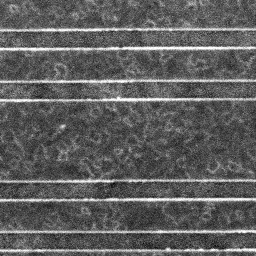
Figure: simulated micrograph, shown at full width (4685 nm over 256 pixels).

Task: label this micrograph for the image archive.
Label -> lines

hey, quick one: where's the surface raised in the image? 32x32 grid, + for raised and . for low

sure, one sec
++++++++++++++++++++++++++++++++
++++++++++++++++++++++++++++++++
++++++++++++++++++++++++++++++++
++++++++++++++++++++++++++++++++
................................
................................
++++++++++++++++++++++++++++++++
++++++++++++++++++++++++++++++++
++++++++++++++++++++++++++++++++
++++++++++++++++++++++++++++++++
................................
................................
.............+++++++++++++++++++
++++++++++++++++++++++++++++++++
++++++++++++++++++++++++++++++++
++++++++++++++++++++++++++++++++
++++++++++++++++++++++++++++++++
++++++++++++++++++++++++++++++++
++++++++++++++++++++++++++++++++
++++++++++++++++++++++++++++++++
++++++++++++++++++++++++++++++++
++++++++++++++++++++++++++++++++
++++++++++++++++++++++++++++++++
................................
................................
++++++++++++++++++++++++++++++++
++++++++++++++++++++++++++++++++
++++++++++++++++++++++++++++++++
++++++++++++++++++++++++++++++++
................................
................................
++++++++++++++++++++++++++++++++